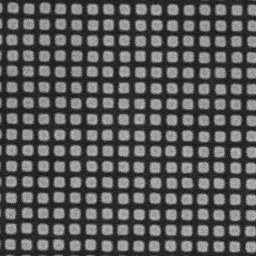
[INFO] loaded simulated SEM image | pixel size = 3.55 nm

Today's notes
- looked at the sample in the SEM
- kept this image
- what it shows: a regular array of raised bodies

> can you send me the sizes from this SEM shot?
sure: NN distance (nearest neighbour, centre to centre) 54.5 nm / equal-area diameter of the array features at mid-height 40.5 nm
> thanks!